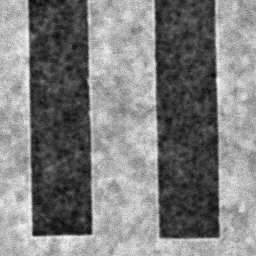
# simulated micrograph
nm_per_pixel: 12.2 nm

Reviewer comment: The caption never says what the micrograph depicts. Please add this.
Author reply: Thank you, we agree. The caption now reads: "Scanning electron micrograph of one or a few lines or trenches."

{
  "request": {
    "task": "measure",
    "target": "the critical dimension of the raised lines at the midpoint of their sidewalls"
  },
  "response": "0.794 microns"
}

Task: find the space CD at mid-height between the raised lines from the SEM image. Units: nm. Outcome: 759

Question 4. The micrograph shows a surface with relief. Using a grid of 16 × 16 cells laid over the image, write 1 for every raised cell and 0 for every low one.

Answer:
1100001111000011
1100001111000011
1100001111000011
1100001111000011
1100001111000011
1100001111000011
1100001111000011
1100001111000011
1100001111000011
1100001111000011
1100001111000011
1100001111000011
1100001111000011
1100001111000011
1100001111000011
1111111111111111